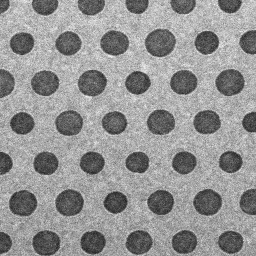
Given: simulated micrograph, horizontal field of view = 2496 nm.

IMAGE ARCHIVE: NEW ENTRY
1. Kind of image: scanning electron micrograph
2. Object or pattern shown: a regular array of holes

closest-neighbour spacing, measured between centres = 446 nanometres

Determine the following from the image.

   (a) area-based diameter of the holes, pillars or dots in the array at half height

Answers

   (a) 251 nm